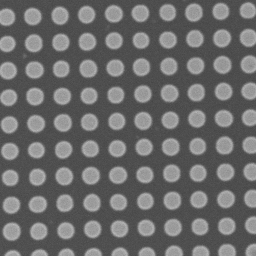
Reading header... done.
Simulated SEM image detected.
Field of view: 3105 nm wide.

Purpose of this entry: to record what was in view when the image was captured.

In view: an array of small figures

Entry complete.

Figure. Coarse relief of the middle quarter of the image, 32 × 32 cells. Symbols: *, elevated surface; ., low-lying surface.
*...****...****..****...****...*
*...****...****..****...****...*
*....***...***....***.....*.....
................................
................................
.........................**.....
*....**....****...***....***...*
**..****...****...****..****...*
**..****...****...***....***....
*....**.....**..................
................................
................................
.............*.....**....***....
*....***...****...****...***...*
**..****...****...****...***...*
**...***....***...***....***....
*...............................
................................
................................
.....***....**.....**....***....
**...***....***...****...****...
**...****..****...****...****...
**...***....***....**.....**....
................................
................................
..........................**....
*....***....***....***...****...
**...****..*****..****...****...
**...****..*****..****...****...
**....**....**.....**...........
................................
................................